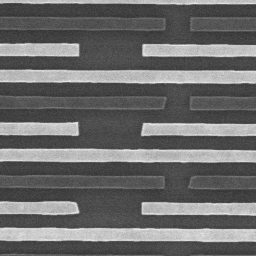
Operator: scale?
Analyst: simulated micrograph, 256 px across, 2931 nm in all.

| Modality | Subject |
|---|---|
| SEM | wiring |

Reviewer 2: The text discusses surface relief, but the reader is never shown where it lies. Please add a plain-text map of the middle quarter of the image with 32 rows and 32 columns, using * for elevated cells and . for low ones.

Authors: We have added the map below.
................................
................................
********************************
********************************
......**************************
................................
................................
................................
*************************.......
*************************.......
*************************.......
................................
................................
................................
................................
***.................************
***.................************
***................*************
................................
................................
................................
*****************.******........
********************************
********************************
................................
................................
................................
................................
*************************.......
*************************......*
*************************......*
................................